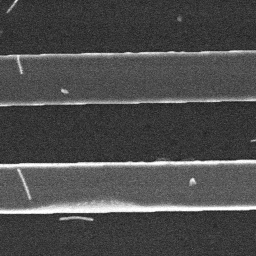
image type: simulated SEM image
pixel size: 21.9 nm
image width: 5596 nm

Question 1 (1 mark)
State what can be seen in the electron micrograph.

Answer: lines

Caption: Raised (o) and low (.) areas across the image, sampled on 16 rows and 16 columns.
................
................
................
oooooooooooooooo
oooooooooooooooo
oooooooooooooooo
ooo.............
................
................
................
oooooooooooooooo
oooooooooooooooo
oooooooooooooooo
................
................
................